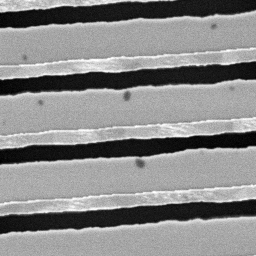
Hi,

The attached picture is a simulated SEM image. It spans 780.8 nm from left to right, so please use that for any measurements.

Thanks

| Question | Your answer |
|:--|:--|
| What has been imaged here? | lines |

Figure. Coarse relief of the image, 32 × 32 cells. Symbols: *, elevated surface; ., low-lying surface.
*************...................
...............................*
................****************
**.*****************************
********************************
********************************
********************************
********************************
*********************...........
*****...........................
...........................*****
......**************************
********************************
********************************
********************************
********************************
*****************************...
***************.................
*..........................*..**
...................*************
.*******************************
********************************
********************************
********************************
********************************
*********************...........
******..........................
........................*.******
...........*********************
********************************
********************************
********************************